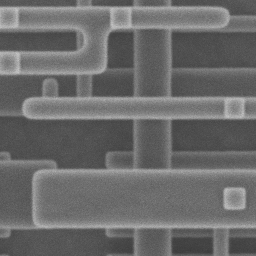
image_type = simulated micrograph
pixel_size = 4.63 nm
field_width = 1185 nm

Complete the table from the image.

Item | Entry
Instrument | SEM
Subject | wiring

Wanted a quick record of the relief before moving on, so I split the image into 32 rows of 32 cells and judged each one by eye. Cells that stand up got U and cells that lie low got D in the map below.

DDDDDDDDDDUUDDDDDUUUUDDDDDDDDDDD
UUUUUUUUUUUUUUUUUUUUUUUUUUUUUDDD
UUUUUUUUUUUUUUUUUUUUUUUUUUUUUDDD
UUUUUUUUUUUUUUUUUUUUUUUUUUDDDDDD
DDDDDDDDDDUUUUDDDUUUUDDDDDDDDDDD
DDDDDDDDDDUUUDDDDUUUUDDDDDDDDDDD
DDDDDDDDDUUUUDDDDUUUUDDDDDDDDDDD
UUUUUUUUUUUUUDDDDUUUUDDDDDDDDDDD
UUUUUUUUUUUUUDDDDUUUUDDDDDDDDDDD
DDDDDDDDDUUUDDDDDUUUUDDDDDDDDDDD
DDDDDUUDDDUDDDDDDUUUUDDDDDDDDDDD
DDDDDUUDDDUDDDDDDUUUUDDDDDDDDDDD
DDDUUUUUUUUUUUUUUUUUUUUUUUUUUUUU
DDDUUUUUUUUUUUUUUUUUUUUUUUUUUUUU
DDDUUUUUUUUUUUUUUUUUUUUUUUUUUUUU
DDDDDDDDDDDDDDDDDUUUUDDDDDDDDDDD
DDDDDDDDDDDDDDDDDUUUUDDDDDDDDDDD
DDDDDDDDDDDDDDDDDUUUUDDDDDDDDDDD
DDDDDDDDDDDDDDDDDUUUUDDDDDDDDDDD
DDDDDDDDDDDDDDDDDUUUUDDDDDDDDDDD
UUUUUUUDDDDDDDDDDUUUUDDDDDDDDDDD
UUUUUUUUUUUUUUUUUUUUUUUUUUUUUUUU
UUUUUUUUUUUUUUUUUUUUUUUUUUUUUUUU
UUUUUUUUUUUUUUUUUUUUUUUUUUUUUUUU
UUUUUUUUUUUUUUUUUUUUUUUUUUUUUUUU
UUUUUUUUUUUUUUUUUUUUUUUUUUUUUUUU
UUUUUUUUUUUUUUUUUUUUUUUUUUUUUUUU
UUUUUUUUUUUUUUUUUUUUUUUUUUUUUUUU
UUUUUUUUUUUUDDDUUUUUUUDUUUUUUUDD
DDDDDDDDDDDDDDDDDUUUUDDDDDDUUDDD
DDDDDDDDDDDDDDDDDUUUUDDDDDDUUDDD
DDDDDDDDDDDDDDDDDUUUUDDDDDDUDDDD